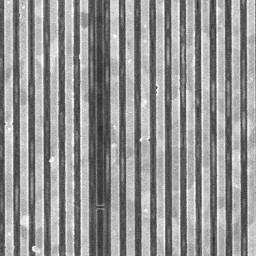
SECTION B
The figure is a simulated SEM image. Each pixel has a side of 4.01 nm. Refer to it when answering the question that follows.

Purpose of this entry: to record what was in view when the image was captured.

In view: parallel lines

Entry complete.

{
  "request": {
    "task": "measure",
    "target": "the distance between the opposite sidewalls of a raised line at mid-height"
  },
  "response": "32.1 nm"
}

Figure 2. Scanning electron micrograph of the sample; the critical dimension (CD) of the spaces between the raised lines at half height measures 29.1 nm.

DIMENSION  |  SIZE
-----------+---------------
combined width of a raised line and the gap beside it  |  15.1 pixels